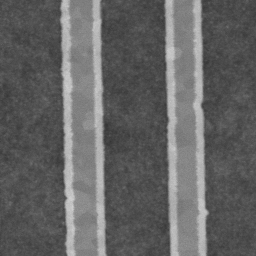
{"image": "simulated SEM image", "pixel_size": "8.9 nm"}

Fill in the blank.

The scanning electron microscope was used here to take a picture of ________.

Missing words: one or a few lines or trenches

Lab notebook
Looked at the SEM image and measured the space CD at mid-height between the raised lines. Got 635 nanometres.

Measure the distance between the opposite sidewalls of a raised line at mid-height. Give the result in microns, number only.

0.275